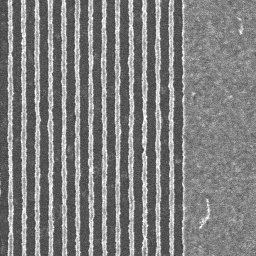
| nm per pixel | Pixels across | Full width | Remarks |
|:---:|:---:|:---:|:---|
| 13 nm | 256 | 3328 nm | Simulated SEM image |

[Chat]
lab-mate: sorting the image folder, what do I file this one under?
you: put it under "parallel lines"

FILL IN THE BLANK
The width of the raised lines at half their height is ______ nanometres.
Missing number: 53.6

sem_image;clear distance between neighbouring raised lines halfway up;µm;0.125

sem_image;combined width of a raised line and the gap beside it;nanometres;174